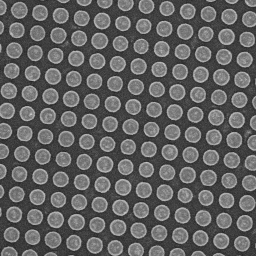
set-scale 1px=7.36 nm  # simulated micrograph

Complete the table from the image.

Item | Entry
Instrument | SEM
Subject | a regular array of raised bodies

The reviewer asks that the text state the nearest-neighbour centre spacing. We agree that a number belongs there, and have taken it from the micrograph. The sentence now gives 149 nanometers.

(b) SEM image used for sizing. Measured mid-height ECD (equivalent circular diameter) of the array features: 111 nm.